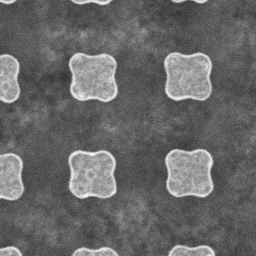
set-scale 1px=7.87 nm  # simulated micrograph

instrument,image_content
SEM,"raised bodies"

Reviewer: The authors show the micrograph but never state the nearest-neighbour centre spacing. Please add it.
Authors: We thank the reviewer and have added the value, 753 nm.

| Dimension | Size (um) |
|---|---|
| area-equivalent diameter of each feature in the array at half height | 0.389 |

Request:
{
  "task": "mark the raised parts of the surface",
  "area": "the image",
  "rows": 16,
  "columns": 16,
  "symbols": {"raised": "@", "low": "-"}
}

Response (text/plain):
----------------
----------------
----------------
@----@@----@@---
@---@@@---@@@---
@---@@@---@@@---
----------------
----------------
----------------
-----------@@---
@---@@@---@@@---
@---@@@----@@---
----------------
----------------
----------------
@----------@@---